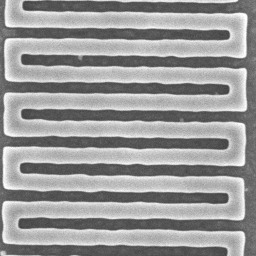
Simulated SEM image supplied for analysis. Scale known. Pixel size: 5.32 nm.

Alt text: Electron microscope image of groups of lines, slits or small figures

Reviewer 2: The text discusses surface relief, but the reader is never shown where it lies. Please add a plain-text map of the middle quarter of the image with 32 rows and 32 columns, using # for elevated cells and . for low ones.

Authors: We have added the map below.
................................
################################
################################
################################
.....##......###################
................................
................................
##.....###......................
################################
################################
################################
............................####
................................
................................
#####################.###.......
################################
################################
################################
................................
................................
................................
################################
################################
################################
################################
................................
................................
................................
################################
################################
################################
################################